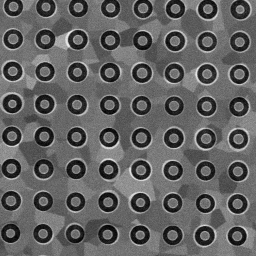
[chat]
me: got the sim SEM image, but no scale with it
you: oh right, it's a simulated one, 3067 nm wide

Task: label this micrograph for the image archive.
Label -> an array of small figures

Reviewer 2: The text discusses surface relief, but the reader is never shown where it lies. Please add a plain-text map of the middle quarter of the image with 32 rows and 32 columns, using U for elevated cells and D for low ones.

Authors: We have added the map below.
UDDDDUUUUUDDDDUUUUDDDUUUUUDDDUUU
UDDDDDUUUDDDDDUUUDDDDDUUUDDDDDUU
UDDDDDUUUDDDDDUUUDDDDDUUUDDDDDUU
UDDDDUUUUDDDDDUUUDDDDDUUUDDDDDUU
UUUDUUUUUUDDUUUUUUDDDUUUUUDDDUUU
UUUUUUUUUUUUUUUUUUUUUUUUUUUUUUUU
UUUUUUUUUUUUUUUUUUUUUUUUUUUUUUUU
UUUUUUUUUUUUUUUUUUUUUUUUUUUUUUUU
UDDDDUUUUUDDDUUUUUDDDUUUUUDDDUUU
UDDDDDUUUDDDDDUUUDDDDDUUUDDDDDUU
UDDDDDUUUDDDDDUUUDDDDDUUUDDDDDUU
UDDDDDUUUDDDDDUUUDDDDDUUUDDDDDUU
UUDDDUUUUUDDUUUUUUDDDUUUUUDDDUUU
UUUUUUUUUUUUUUUUUUUUUUUUUUUUUUUU
UUUUUUUUUUUUUUUUUUUUUUUUUUUUUUUU
UUUUUUUUUUUUUUUUUUUUUUUUUUUUUUUU
UDDDDUUUUUDDDUUUUUDDDUUUUUDDDUUU
UDDDDDUUUDDDDDUUUDDDDDUUUDDDDDUU
UDDDDDUUUDDDDDUUUDDDDDUUUDDDDDUU
UDDDDUUUUDDDDDUUUDDDDDUUUDDDDDUU
UUDDDUUUUUDDDUUUUUDDDUUUUUDDDUUU
UUUUUUUUUUUUUUUUUUUUUUUUUUUUUUUU
UUUUUUUUUUUUUUUUUUUUUUUUUUUUUUUU
UUUUUUUUUUUUUUUUUUUUUUUUUUUUUUUU
UDDDDUUUUUDDDUUUUDDDDUUUUUDDDUUU
UDDDDUUUUDDDDDUUUDDDDDUUUDDDDUUU
DDDDDDUUUDDDDDUUDDDDDDUUUDDDDDUU
UDDDDUUUUDDDDDUUUDDDDDUUUDDDDDUU
UUDDUUUUUUDDDUUUUUDDDUUUUUDDDUUU
UUUUUUUUUUUUUUUUUUUUUUUUUUUUUUUU
UUUUUUUUUUUUUUUUUUUUUUUUUUUUUUUU
UUUUUUUUUUUUUUUUUUUUUUUUUUUUUUUU